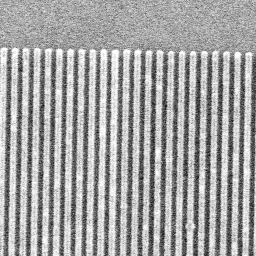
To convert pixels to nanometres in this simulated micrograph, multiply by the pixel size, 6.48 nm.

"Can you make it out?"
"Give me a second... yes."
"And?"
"parallel lines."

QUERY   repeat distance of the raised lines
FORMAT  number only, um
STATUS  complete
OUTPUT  0.0721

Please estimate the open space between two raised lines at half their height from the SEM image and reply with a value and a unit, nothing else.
6.5 px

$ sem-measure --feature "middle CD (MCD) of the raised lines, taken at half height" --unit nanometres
29.9